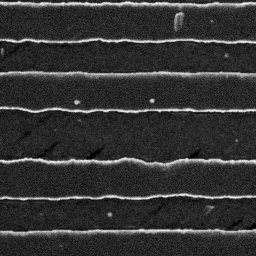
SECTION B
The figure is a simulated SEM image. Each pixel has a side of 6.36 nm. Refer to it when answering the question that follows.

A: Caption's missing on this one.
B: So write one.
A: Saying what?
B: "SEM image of lines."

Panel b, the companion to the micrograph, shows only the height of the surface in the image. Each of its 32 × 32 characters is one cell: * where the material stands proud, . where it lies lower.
************************..**..**
********************************
********************************
********************************
********************************
................................
................................
................................
................................
********************************
********************************
********************************
********************************
********************************
................................
................................
................................
................................
................................
................................
********************************
********************************
********************************
********************************
*********************...********
................................
................................
................................
................................
********************************
********************************
********************************